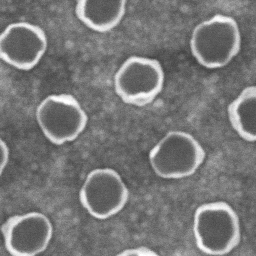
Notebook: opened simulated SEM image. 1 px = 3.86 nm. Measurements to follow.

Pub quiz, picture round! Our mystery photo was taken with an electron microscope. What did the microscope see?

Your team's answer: raised bodies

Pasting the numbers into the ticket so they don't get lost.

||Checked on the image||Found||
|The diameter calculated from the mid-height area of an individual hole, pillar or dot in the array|46.9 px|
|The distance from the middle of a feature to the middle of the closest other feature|0.321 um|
